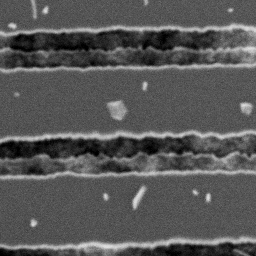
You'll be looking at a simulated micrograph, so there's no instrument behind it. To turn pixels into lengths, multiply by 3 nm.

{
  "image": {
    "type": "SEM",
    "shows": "lines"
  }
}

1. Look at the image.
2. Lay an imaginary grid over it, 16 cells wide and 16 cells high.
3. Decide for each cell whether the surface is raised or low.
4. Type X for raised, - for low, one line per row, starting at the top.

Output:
XXXXXXXXXXXXXXXX
XXXXXXXXXXXXXXXX
----------------
----------------
XXXXXXXXXXXXXXXX
XXXXXXXXXXXXXXXX
XXXXXXXXXXXXXXXX
XXXXXXXXXXXXXXXX
XXXXXXXXXXX--XX-
----------------
----------------
XXXXXXXXXXXXXXXX
XXXXXXXXXXXXXXXX
XXXXXXXXXXXXXXXX
XXXXXXXXXXXXXXXX
XX-X------------